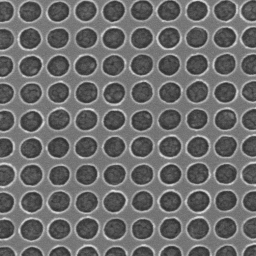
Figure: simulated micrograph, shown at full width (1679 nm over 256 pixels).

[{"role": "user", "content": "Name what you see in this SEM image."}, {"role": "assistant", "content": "a regular array of holes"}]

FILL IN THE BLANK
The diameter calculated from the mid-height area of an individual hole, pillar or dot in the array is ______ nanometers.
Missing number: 140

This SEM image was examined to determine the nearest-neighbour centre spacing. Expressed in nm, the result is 177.